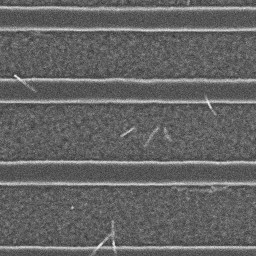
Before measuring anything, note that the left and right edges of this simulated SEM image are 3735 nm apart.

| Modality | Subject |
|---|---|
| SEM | lines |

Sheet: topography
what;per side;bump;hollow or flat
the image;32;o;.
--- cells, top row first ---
................................
oooooooooooooooooooooooooooooooo
oooooooooooooooooooooooooooooooo
oooooooooooooooooooooooooooooooo
................................
................................
................................
................................
................................
................................
oooooooooooooooooooooooooooooooo
oooooooooooooooooooooooooooooooo
oooooooooooooooooooooooooooooooo
................................
................................
................................
................................
................................
................................
................................
oooooooooooooooooooooooooooooooo
oooooooooooooooooooooooooooooooo
oooooooooooooooooooooooooooooooo
................................
................................
................................
................................
................................
................................
................................
................................
oooooooooooooooooooooooooooooooo